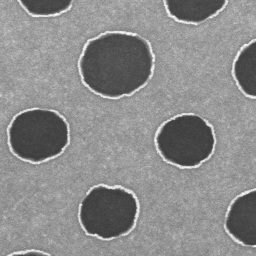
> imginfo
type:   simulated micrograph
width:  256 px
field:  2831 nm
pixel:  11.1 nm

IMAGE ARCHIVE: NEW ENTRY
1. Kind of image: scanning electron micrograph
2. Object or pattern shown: holes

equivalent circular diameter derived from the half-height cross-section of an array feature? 597 nanometres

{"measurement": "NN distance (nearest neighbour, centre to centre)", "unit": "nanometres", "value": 1150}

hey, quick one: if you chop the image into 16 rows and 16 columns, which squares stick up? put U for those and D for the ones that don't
UUDDUUUUUUUDDDUU
UUUUUUUUUUUUUUUU
UUUUUUDDDUUUUUUU
UUUUUDDDDUUUUUUD
UUUUUDDDDUUUUUUD
UUUUUUDDDUUUUUUD
UUUUUUUUUUUUUUUU
UDDDUUUUUUUDDUUU
UDDDUUUUUUDDDUUU
UDDDUUUUUUDDDUUU
UUUUUUUUUUUUUUUU
UUUUUUUUUUUUUUUU
UUUUUDDDUUUUUUUD
UUUUUDDDUUUUUUDD
UUUUUUDDUUUUUUDD
UUUUUUUUUUUUUUUU